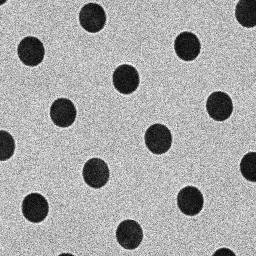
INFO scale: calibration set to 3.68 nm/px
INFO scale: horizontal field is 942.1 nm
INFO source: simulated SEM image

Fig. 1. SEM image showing a regular array of holes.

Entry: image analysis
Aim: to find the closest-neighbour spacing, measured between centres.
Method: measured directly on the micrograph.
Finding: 253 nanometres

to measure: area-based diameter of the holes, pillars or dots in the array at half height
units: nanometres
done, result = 104